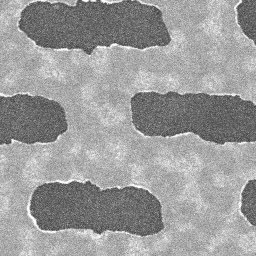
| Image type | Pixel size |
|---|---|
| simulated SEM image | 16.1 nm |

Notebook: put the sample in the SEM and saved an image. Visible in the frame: holes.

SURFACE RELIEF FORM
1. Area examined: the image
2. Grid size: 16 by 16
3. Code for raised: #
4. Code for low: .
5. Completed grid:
##........#####.
#.........#####.
##.........#####
################
################
################
....####........
....####........
....#####..#....
################
################
###...#########.
##........#####.
##........#####.
######....######
################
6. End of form